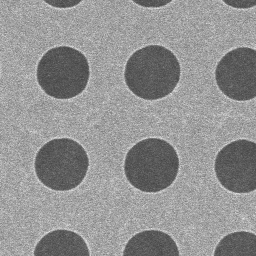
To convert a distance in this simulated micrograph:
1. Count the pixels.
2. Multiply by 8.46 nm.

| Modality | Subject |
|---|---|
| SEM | holes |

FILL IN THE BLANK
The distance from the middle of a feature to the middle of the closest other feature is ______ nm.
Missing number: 759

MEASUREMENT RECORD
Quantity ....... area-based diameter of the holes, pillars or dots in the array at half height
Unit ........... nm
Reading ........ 461